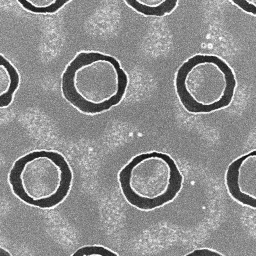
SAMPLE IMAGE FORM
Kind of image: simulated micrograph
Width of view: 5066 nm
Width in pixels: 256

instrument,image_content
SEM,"ring-shaped grooves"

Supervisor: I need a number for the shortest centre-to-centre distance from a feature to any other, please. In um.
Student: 2.15